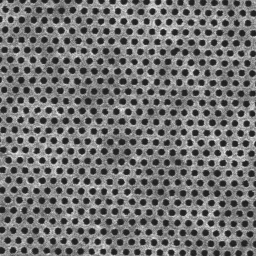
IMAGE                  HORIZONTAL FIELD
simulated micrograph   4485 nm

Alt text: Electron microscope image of a regular array of holes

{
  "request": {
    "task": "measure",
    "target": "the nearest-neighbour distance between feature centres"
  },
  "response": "0.193 µm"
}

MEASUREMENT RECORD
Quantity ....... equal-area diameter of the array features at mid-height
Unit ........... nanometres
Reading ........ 122